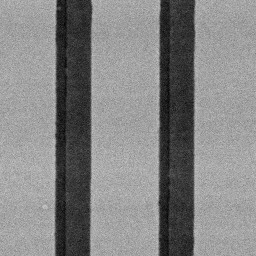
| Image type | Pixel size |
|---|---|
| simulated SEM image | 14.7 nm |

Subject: lines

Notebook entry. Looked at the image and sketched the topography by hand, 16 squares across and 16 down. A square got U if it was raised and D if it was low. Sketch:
UUUUDDUUUUDDUUUU
UUUUDDUUUUDDUUUU
UUUDDDUUUUDDUUUU
UUUDDDUUUUDDUUUU
UUUDDDUUUUDDUUUU
UUUDDDUUUUDDUUUU
UUUDDDUUUUDDUUUU
UUUDDDUUUUDDUUUU
UUUDDDUUUUDDUUUU
UUUDDDUUUUDDUUUU
UUUDDDUUUUDDUUUU
UUUDDDUUUUDDUUUU
UUUDDDUUUUDDUUUU
UUUDDDUUUUDDUUUU
UUUDDDUUUUDDUUUU
UUUDDDUUUUDDUUUU